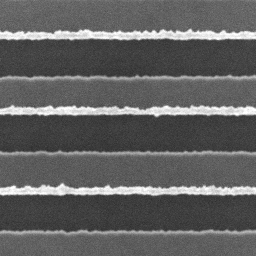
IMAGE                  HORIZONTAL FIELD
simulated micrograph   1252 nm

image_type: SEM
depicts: lines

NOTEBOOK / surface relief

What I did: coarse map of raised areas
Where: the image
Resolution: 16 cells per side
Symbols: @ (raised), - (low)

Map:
@@@@@@@@@@@@@@@@
@@@@@@@@@@@@@@@@
----------------
----------------
----------------
@@@@@@@@@@@@@@@@
@@@@@@@@@@@@@@@@
----------------
----------------
--@@-@------@@-@
@@@@@@@@@@@@@@@@
@@@@@@@@@@@@@@@@
----------------
----------------
@@@@@@@@@@@@@@@@
@@@@@@@@@@@@@@@@